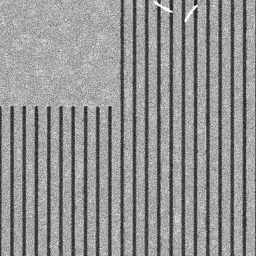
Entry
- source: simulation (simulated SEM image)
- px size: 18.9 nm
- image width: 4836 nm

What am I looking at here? parallel lines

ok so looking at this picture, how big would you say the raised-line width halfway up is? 163 nanometers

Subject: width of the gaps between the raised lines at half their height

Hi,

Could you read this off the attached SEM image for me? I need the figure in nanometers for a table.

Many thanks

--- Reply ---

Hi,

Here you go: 63.8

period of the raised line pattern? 0.231 micrometres